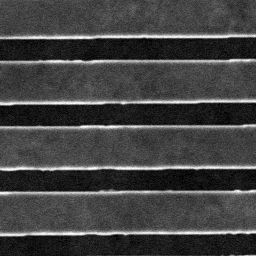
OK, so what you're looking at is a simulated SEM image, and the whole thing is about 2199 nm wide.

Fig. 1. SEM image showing lines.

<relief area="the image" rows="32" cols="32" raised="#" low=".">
################################
################################
################################
################################
################################
................................
................................
............................####
################################
################################
################################
################################
################################
................................
................................
................................
################################
################################
################################
################################
################################
................................
................................
................................
################################
################################
################################
################################
################################
................................
................................
................................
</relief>